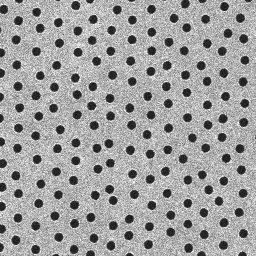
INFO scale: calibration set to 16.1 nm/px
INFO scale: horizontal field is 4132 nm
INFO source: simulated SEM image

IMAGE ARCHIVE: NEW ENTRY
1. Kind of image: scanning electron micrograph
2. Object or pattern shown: a regular array of holes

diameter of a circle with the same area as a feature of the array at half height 149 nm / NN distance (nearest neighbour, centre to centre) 297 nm